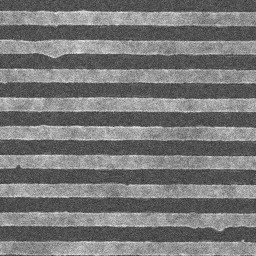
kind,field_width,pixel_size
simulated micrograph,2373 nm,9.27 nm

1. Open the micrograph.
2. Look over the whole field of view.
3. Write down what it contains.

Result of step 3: parallel lines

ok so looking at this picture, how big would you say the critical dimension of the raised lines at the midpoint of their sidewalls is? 12.6 px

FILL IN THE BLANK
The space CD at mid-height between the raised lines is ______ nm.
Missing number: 147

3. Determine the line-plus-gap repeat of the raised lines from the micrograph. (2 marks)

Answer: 267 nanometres